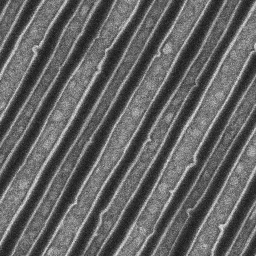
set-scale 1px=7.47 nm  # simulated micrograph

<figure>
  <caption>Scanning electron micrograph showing parallel lines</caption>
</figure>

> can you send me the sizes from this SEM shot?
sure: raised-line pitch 232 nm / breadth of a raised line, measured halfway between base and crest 109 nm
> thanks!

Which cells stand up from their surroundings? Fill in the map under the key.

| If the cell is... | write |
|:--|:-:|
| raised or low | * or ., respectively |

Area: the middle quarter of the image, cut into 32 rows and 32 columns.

****.....*****...*****.....*****
***......****....****.....*****.
**......*****...****......****..
**.....*****....****.....*****..
*......****....****......****...
*.....*****...*****.....*****...
......****....****......****....
.....*****...****......*****...*
.....****....****......****....*
....*****...****......****....**
....****....****.....*****...***
...****....****......****....***
...****...*****.....****....****
..****....****......****....****
.*****...****......****....****.
.****....****......****....****.
*****...****......****....****..
****...*****......****....****..
****...****......****....****...
***...*****.....*****....****...
**...*****......****....****....
**...*****.....*****....***.....
*...*****......****....****.....
....*****.....*****....***......
...*****......****....****......
...*****.....****....****......*
..*****.....****.....****.....**
..*****.....****....*****.....**
.*****.....****.....****.....***
.****.....*****....*****.....***
*****.....****.....****.....****
****.....*****....*****....*****